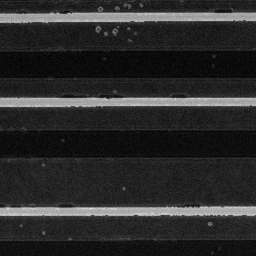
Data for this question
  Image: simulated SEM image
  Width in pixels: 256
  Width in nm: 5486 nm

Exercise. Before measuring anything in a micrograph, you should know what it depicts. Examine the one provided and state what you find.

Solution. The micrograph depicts lines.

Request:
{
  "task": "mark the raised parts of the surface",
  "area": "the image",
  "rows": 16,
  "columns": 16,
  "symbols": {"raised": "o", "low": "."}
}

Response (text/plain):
................
................
................
oooooooooooooooo
oooooooooooooooo
................
......o.........
................
oooooooooooooooo
oooooooooooooooo
................
................
................
................
................
oooooooooooooooo